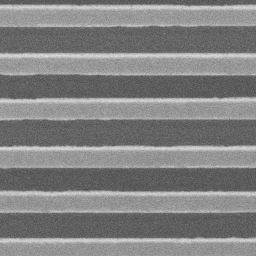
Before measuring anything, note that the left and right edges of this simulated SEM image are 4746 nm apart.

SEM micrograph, lines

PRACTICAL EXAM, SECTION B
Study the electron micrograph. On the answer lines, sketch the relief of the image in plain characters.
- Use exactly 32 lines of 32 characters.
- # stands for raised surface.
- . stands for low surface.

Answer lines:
................................
################################
################################
................................
................................
................................
................................
################################
################################
................................
................................
................................
################################
################################
################################
................................
................................
................................
################################
################################
################################
................................
................................
................................
################################
################################
................................
................................
................................
................................
################################
################################